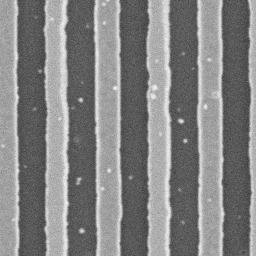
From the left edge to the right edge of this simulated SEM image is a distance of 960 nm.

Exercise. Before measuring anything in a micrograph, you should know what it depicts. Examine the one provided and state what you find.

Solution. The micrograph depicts lines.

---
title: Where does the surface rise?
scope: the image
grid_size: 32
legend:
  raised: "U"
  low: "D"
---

UUDDDDUUDDDDUUUDDDDUUDDDDUUUDDDU
UUDDDDUUDDDDUUUDDDDUUDDDDUUUDDDU
UUDDDDUUDDDDUUUDDDDUUDDDDUUUDDDU
UUDDDDUUDDDDUUUDDDDUUDDDDUUUDDDU
UUDDDDUUDDDDUUUDDDUUUDDDDUUUDDDU
UUDDDDUUDDDDUUUDDDUUUDDDDUUUDDDU
UUDDDDUUDDDDUUUDDDUUUDDDDUUUDDDU
UUDDDDUUDDDDUUUDDDUUUDDDDUUUDDDU
UUDDDDUUDDDDUUUDDDUUUDDDDUUUDDDU
UUDDDDUUDDDDUUUDDDDUUDDDDUUUDDDU
UUDDDDUUDDDDUUUDDDDUUDDDDUUUDDDU
UUDDDDUUDDDDUUUDDDDUUDDDDUUUDDDU
UUDDDDUUDDDDUUUDDDUUUDDDDUUUDDDU
UUDDDDUUDDDDUUUDDDDUUDDDDUUUDDDU
UUDDDDUUDDDDUUUDDDDUUDDDDUUUDDDU
UUDDDDUUDDDDUUUDDDDUUDDDDUUUDDDU
UUDDDDUUDDDDUUUDDDDUUDDDDUUUDDDU
UUDDDDUUDDDDUUUDDDDUUDDDDUUUDDDU
UUDDDDUUDDDDUUUDDDDUUDDDDUUUDDDU
UUDDDDUUDDDDUUUDDDDUUDDDDUUUDDDU
UUDDDDUUDDDDUUUDDDDUUDDDDUUUDDDU
UUDDDDUUDDDDUUUDDDDUUDDDDUUUDDDU
UUDDDDUUDDDDUUUDDDDUUDDDDUUUDDDU
UUDDDDUUDDDDUUUDDDDUUDDDDUUUDDDU
UUDDDDUUDDDDUUUDDDDUUDDDDUUUDDDU
UUDDDDUUDDDDUUUDDDDUUDDDDUUUDDDU
UUDDDDUUDDDDUUUDDDDUUDDDDUUUDDDU
UUDDDDUUDDDDUUUDDDDUUDDDDUUUDDDU
UUDDDDUUDDDDUUUDDDDUUDDDDUUUDDDU
UUDDDDUUDDDDUUUDDDDUUDDDDUUUDDDU
UUDDDDUUDDDDUUUDDDDUUDDDDUUUDDDU
UUDDDDUUDDDDUUUDDDDUUDDDDUUUDDDU